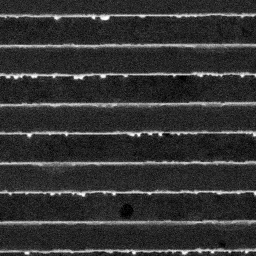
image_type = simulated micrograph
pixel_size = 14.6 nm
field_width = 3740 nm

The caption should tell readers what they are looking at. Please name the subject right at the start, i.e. lines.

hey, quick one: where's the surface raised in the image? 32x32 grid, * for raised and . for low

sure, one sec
********************************
********************************
................................
................................
................................
................................
********************************
********************************
********************************
................................
................................
................................
................................
********************************
********************************
********************************
********************************
................................
................................
................................
********************************
********************************
********************************
********************************
................................
................................
................................
................................
********************************
********************************
********************************
.....*..........................